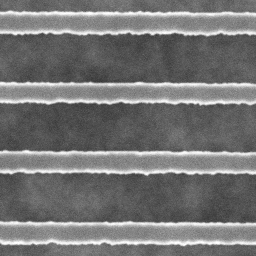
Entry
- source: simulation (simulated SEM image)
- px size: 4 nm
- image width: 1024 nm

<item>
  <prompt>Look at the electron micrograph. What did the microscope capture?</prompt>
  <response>lines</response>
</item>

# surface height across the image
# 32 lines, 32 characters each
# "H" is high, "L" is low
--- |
LLLLLLLLLLLLLLLLLLLLLLLLLLLLLLLL
LHLHLLLLLLLLLLLLLLLLLLLLLLLLLLLL
HHHHHHHHHHHHHHHHHHHHHHHHHHHHHHHH
HHHHHHHHHHHHHHHHHHHHHHHHHHHHHHHH
LLLLLLLLLLLLLLLLLLLLLLLLLLLLLLLL
LLLLLLLLLLLLLLLLLLLLLLLLLLLLLLLL
LLLLLLLLLLLLLLLLLLLLLLLLLLLLLLLL
LLLLLLLLLLLLLLLLLLLLLLLLLLLLLLLL
LLLLLLLLLLLLLLLLLLLLLLLLLLLLLLLL
LLLLLLLLLLLLLLLLLLLLLLLLLLLLLLLL
HHHHHHHHHHHHHHHHHHHHHHHHHHHHHHHH
HHHHHHHHHHHHHHHHHHHHHHHHHHHHHHHH
HHHHHHHHHHHHHHHHHHHHHHHHHHHHHHHH
LLLLLLLLLLLLLLLLLLLLLLLLLLLLLLLL
LLLLLLLLLLLLLLLLLLLLLLLLLLLLLLLL
LLLLLLLLLLLLLLLLLLLLLLLLLLLLLLLL
LLLLLLLLLLLLLLLLLLLLLLLLLLLLLLLL
LLLLLLLLLLLLLLLLLLLLLLLLLLLLLLLL
LLLLLLLLLLLLLLLLLLLLLLLLLLLLLLLL
HHHHHHHHHHHHHHHHHHHHHHHHHHHHHHHH
HHHHHHHHHHHHHHHHHHHHHHHHHHHHHHHH
HHLHLHHHHLLLHHHHHHHHHLHHHHHHHHHH
LLLLLLLLLLLLLLLLLLLLLLLLLLLLLLLL
LLLLLLLLLLLLLLLLLLLLLLLLLLLLLLLL
LLLLLLLLLLLLLLLLLLLLLLLLLLLLLLLL
LLLLLLLLLLLLLLLLLLLLLLLLLLLLLLLL
LLLLLLLLLLLLLLLLLLLLLLLLLLLLLLLL
LLLLLLLLLLLLLLLLLLLLLLLLLLLLLLLL
HHHHHHHHHHHHHHHHHHHHHHHHHHHHHHHH
HHHHHHHHHHHHHHHHHHHHHHHHHHHHHHHH
LLLLLLLLLLLLLLLLLLLLLLLLLLLLLLLL
LLLLLLLLLLLLLLLLLLLLLLLLLLLLLLLL